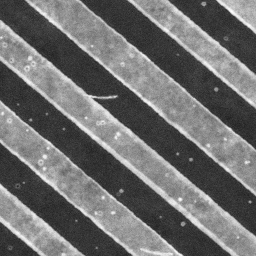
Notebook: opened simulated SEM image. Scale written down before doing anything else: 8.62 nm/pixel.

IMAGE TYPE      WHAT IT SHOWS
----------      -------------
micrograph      lines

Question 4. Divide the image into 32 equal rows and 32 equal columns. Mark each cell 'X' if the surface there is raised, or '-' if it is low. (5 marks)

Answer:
----XXXXXX-------XXXX-------XXXX
-----XXXXXXX------XXXXX------XXX
------XXXXXXX------XXXXX------XX
X------XXXXXXX------XXXXX------X
XX------XXXXXXX------XXXXX------
XXX-------XXXXXX-------XXXX-----
XXXXX------XXXXXX-------XXXX----
XXXXXX------XXXXXXX------XXXXX--
-XXXXXX------XXXXXXX------XXXXX-
---XXXXX------XXXXXXX------XXXXX
----XXXXX-------XXXXXX------XXXX
-----XXXXXX------XXXXXX-------XX
------XXXXXX------XXXXXX-------X
X------XXXXXX------XXXXXXX------
XX------XXXXXX------XXXXXXX-----
XXX-------XXXXX------XXXXXXX----
XXXXX------XXXXX-------XXXXXX---
XXXXXX------XXXXXX------XXXXXXX-
-XXXXXX------XXXXXX------XXXXXXX
--XXXXXX------XXXXXX------XXXXXX
---XXXXXX-------XXXXX------XXXXX
----XXXXXX-------XXXXX-------XXX
------XXXXXX------XXXXX-------XX
-------XXXXXX------XXXXXX------X
XX------XXXXXX------XXXXXX------
XXX------XXXXXX-------XXXXX-----
XXXX------XXXXXX-------XXXXX----
XXXXX------XXXXXXX------XXXXX---
-XXXXX-------XXXXXX------XXXXX--
--XXXXX-------XXXXXX------XXXXXX
----XXXXX------XXXXXX------XXXXX
-----XXXXX------XXXXXX-------XXX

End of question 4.